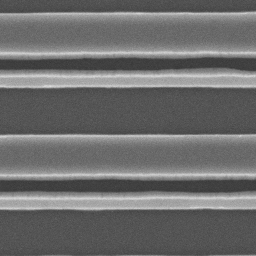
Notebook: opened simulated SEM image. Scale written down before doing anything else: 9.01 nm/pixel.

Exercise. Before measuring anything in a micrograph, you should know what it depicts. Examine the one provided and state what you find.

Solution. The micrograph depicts lines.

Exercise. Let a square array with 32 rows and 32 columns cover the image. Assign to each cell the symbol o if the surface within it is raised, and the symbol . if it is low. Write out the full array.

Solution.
................................
................................
oooooooooooooooooooooooooooooooo
oooooooooooooooooooooooooooooooo
oooooooooooooooooooooooooooooooo
oooooooooooooooooooooooooooooooo
oooooooooooooooooooooooooooooooo
................................
................................
oooooooooooooooooooooooooooooooo
oooooooooooooooooooooooooooooooo
................................
................................
................................
................................
................................
................................
oooooooooooooooooooooooooooooooo
oooooooooooooooooooooooooooooooo
oooooooooooooooooooooooooooooooo
oooooooooooooooooooooooooooooooo
oooooooooooooooooooooooooooooooo
................................
................................
oooooooooooooooooooooooooooooooo
oooooooooooooooooooooooooooooooo
................................
................................
................................
................................
................................
................................